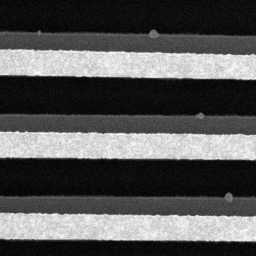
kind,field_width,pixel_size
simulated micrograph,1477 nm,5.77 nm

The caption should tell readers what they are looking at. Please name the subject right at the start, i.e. lines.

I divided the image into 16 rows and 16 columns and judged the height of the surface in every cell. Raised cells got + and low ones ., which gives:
................
................
++++++++++++++++
++++++++++++++++
++++++++++++++++
................
................
++++++++++++++++
++++++++++++++++
++++++++++++++++
................
................
++++++++++++++++
++++++++++++++++
++++++++++++++++
................